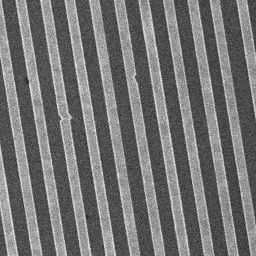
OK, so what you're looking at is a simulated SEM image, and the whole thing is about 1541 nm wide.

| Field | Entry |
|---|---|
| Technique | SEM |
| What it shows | parallel lines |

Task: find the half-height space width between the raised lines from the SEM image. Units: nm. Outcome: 92.1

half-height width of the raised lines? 56.5 nm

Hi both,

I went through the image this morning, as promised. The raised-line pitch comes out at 145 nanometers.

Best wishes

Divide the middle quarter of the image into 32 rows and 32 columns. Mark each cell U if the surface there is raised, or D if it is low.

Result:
DDDUUDDDDUUDDDDUUUDDDUUUDDDUUUDD
DDDUUDDDDUUUDDDDUUDDDDUUDDDDUUDD
DDDUUDDDDUUUDDDDUUDDDDUUDDDDUUDD
DDDDUUDDDDUUDDDDUUDDDDUUDDDDUUDD
DDDDUUDDDDUUDDDDUUDDDDUUDDDDUUDD
DDDDUUDDDDUUDDDDUUDDDDUUDDDDUUUD
DDDDUUDDDDUUDDDDUUUDDDUUUDDDUUUD
DDDDUUDDDDUUDDDDDUUDDDDUUDDDDUUD
DDDDUUDDDDUUUDDDDUUDDDDUUDDDDUUD
DDDDDUUDDDDUUDDDDUUDDDDUUDDDDUUD
UDDDDUUDDDDUUDDDDUUDDDDUUDDDDUUD
UDDDDUUDDDDUUDDDDUUDDDDUUDDDDUUD
UDDDDUUDDDDUUDDDDUUUDDDUUUDDDUUU
UUDDDUUDDDDUUDDDDUUUDDDDUUDDDDUU
UDDDDUUDDDDUUUDDDDUUDDDDUUDDDDUU
UDDDDUUUDDDDUUDDDDUUDDDDUUDDDDUU
UUDDDDUUDDDDUUDDDDUUDDDDUUDDDDUU
UUDDDDUUDDDDUUDDDDUUDDDDUUDDDDUU
UUDDDDUUDDDDUUDDDDUUUDDDUUUDDDUU
UUDDDDUUDDDDUUDDDDUUUDDDUUUDDDDU
UUDDDDUUDDDDUUUDDDUUUDDDDUUDDDDU
UUDDDDUUDDDDUUUDDDDUUDDDDUUDDDDU
UUUDDDDUUDDDDUUDDDDUUDDDDUUDDDDU
UUUDDDDUUDDDDUUDDDDUUDDDDUUDDDDU
DUUDDDDUUDDDDUUDDDDUUDDDDUUUDDDU
DUUDDDDUUDDDDUUDDDDUUUDDDUUUDDDU
DUUDDDDUUDDDDUUUDDDDUUDDDDUUDDDD
DUUDDDDUUUDDDUUUDDDDUUDDDDUUDDDD
DUUUDDDDUUDDDDUUDDDDUUDDDDUUDDDD
DUUUDDDDUUDDDDUUDDDDUUDDDDUUDDDD
DDUUDDDDUUDDDDUUDDDDUUDDDDUUDDDD
DDUUDDDDUUDDDDUUDDDDUUUDDDUUUDDD